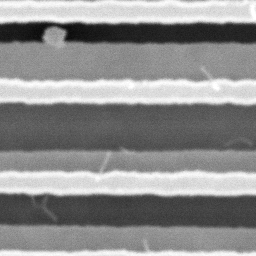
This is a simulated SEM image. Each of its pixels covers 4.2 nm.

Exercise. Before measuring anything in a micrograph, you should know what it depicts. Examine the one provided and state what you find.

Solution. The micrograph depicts lines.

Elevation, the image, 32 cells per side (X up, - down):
XXXXXXXXXXXXXXXXXXXXXXXXXXXXXXXX
XXXXXXXXXXXXXXXXXXXXXXXXXXXXXXXX
XXXXXXXXXXXXXXXXXXXXXXXXXXXXXXXX
------XX------------------------
-----XXX------------------------
XXXXXXXXXXXXXXXXX-XXXXXXXXXXXXXX
XXXXXXXXXXXXXXXXXXXXXXXXXXXXXXXX
XXXXXXXXXXXXXXXXXXXXXXXXXXXXXXXX
XXXXXXXXXXXXXXXXXXXXXXXXXXXXXXXX
XXXXXXXXXXXXXXXXXXXXXXXXXXXXXXXX
XXXXXXXXXXXXXXXXXXXXXXXXXXXXXXXX
XXXXXXXXXXXXXXXXXXXXXXXXXXXXXXXX
XXXXXXXXXXXXXXXXXXXXXXXXXXXXXXXX
--------------------------------
--------------------------------
--------------------------------
--------------------------------
--------------------------------
--------------------------------
XXXXXXXXXXXXXXXXXXXXXXXXXXXXXXXX
XXXXXXXXXXXXXXXXXXXXXXXXXXXXXXXX
XXXXXXXXXXXXXXXXXXXXXXXXXXXXXXXX
XXXXXXXXXXXXXXXXXXXXXXXXXXXXXXXX
XXXXXXXXXXXXXXXXXXXXXXXXXXXXXXXX
--------------------------------
--------------------------------
--------------------------------
--------------------------------
XXXXXXXXXXXXXXXXXXXXXXXXX-------
XXXXXXXXXXXXXXXXXXXXXXXXXXXXXXXX
XXXXXXXXXXXXXXXXXXXXXXXXXXXXXXXX
XXXXXXXXXXXXXXXXXXXXXXXXXXXXXXXX